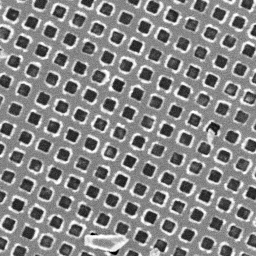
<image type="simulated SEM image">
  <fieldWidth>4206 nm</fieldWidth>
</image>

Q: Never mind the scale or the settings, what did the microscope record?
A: a regular array of holes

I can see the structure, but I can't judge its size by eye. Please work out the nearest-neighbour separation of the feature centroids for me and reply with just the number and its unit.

341 nm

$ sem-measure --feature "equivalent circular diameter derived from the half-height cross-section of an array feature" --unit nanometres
219